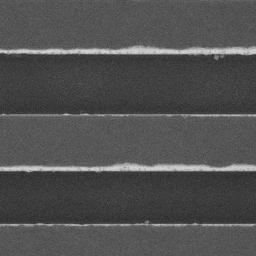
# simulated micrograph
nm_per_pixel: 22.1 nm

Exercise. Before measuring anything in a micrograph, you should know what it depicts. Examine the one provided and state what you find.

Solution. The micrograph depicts lines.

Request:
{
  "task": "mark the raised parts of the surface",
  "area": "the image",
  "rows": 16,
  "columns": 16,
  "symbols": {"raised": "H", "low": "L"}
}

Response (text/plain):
HHHHHHHHHHHHHHHH
HHHHHHHHHHHHHHHH
HHHHHHHHHHHHHHHH
LLLLLLLLLLLLLLLL
LLLLLLLLLLLLLLLL
LLLLLLLLLLLLLLLL
LLLLLLLLLLLLLLLL
HHHHHHHHHHHHHHHH
HHHHHHHHHHHHHHHH
HHHHHHHHHHHHHHHH
HHHHHHHHHHHHHHHH
LLLLLLLLLLLLLLLL
LLLLLLLLLLLLLLLL
LLLLLLLLLLLLLLLL
HHHHHHHHHHHHHHHH
HHHHHHHHHHHHHHHH